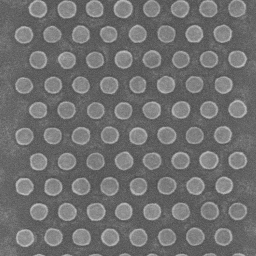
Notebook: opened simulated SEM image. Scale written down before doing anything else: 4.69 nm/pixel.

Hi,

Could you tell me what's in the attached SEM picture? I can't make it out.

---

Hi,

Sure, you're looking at a regular array of raised bodies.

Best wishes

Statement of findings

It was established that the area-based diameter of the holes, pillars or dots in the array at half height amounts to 79.4 nm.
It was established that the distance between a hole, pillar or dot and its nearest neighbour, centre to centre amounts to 132 nm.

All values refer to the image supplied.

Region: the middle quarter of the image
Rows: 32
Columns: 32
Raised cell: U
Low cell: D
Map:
UUDDDDUUUDDDDDUUDDDDDUUDDDDDUUDD
DDDDDDDDDDDDDDDDDDDDDDDDDDDDDDDD
DDDDDDDDDDDDDDDDDDDDDDDDDDDDDDDD
DDDUUDDDDDDUDDDDDUUDDDDDUUUDDDDU
DDUUUUDDDUUUUDDDDUUUDDDDUUUDDDDU
DDUUUUDDDUUUUDDDDUUUDDDUUUUDDDDU
DDDUUUDDDUUUUDDDDUUUDDDDUUUDDDDU
DDDDDDDDDDDDDDDDDDDDDDDDDDDDDDDD
DDDDDDDDDDDDDDDDDDDDDDDDDDDDDDDD
DDDDDDDDDDDDDDDDDDDDDDDDDDDDDUDD
UUUDDDUUUUDDDUUUUDDDUUUUDDDDUUUD
UUUDDDUUUUDDDUUUUDDDUUUUDDDUUUUD
UUDDDDUUUUDDDUUUUDDDUUUUDDDUUUUD
DDDDDDDUUDDDDDUUDDDDDUUDDDDDDDDD
DDDDDDDDDDDDDDDDDDDDDDDDDDDDDDDD
DDDDDDDDDDDDDDDDDDDDDDDDDDDDDDDD
DDDUUUDDDDUUUDDDDUUUDDDDUUUDDDDU
DDUUUUDDDDUUUUDDDUUUUDDDUUUUDDDU
DDUUUUDDDUUUUDDDDUUUUDDDUUUUDDDU
DDDUUUDDDDUUUDDDDUUUDDDDUUUDDDDU
DDDDDDDDDDDDDDDDDDDDDDDDDDDDDDDD
DDDDDDDDDDDDDDDDDDDDDDDDDDDDDDDD
UUDDDDDUUDDDDDUUDDDDDUUDDDDDUUDD
UUUDDDUUUUDDDUUUUDDDUUUUDDDUUUUD
UUUDDDUUUUDDDUUUUDDDUUUUDDDUUUUD
UUDDDDUUUUDDDUUUUDDDUUUUDDDDUUUD
DDDDDDDDDDDDDDDDDDDDDDDDDDDDDDDD
DDDDDDDDDDDDDDDDDDDDDDDDDDDDDDDD
DDDDDDDDDDDDDDDDDDDDDDDDDUDDDDDD
DDDUUUDDDDUUUDDDDUUUDDDDUUUUDDDU
DDUUUUDDDUUUUDDDDUUUUDDDUUUUDDDU
DDUUUUDDDDUUUDDDDUUUDDDDUUUUDDDU